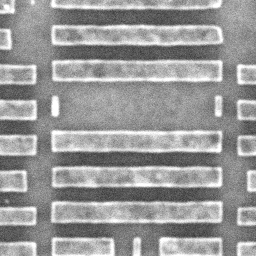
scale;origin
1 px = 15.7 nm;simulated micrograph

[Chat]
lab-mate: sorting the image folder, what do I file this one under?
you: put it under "wiring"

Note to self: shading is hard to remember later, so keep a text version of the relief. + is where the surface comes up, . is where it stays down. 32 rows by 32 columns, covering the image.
++.....++++++++++++++++++++.....
+...............................
................................
.......++++++++++++++++++++.....
+......+++++++++++++++++++++....
+...................++..........
................................
................................
++++...+++++++++++++++++++++..++
++++...+++++++++++++++++++++..++
................................
................................
...........................+....
++++.......................+..++
++++..........................++
................................
.......+......++........+++.....
++++...+++++++++++++++++++++..++
++++...++++++++++++++++++++...++
................................
................................
+++....+++++++++++++++++++++...+
+++....+++++++++++++++++++++...+
+++............................+
................................
.......++++++++++++++++++++.....
++++...+++++++++++++++++++++..++
++++...++++++++++++++++++++...++
................................
................................
++++...+++++++......++++++++..++
++++...+++++++......++++++++..++